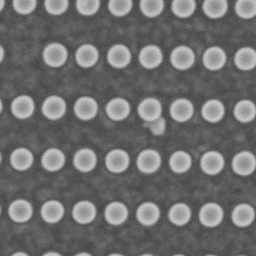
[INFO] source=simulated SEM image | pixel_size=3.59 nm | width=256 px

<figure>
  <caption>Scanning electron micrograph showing a regular array of raised bodies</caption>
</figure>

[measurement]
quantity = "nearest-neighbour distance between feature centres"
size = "31.6 px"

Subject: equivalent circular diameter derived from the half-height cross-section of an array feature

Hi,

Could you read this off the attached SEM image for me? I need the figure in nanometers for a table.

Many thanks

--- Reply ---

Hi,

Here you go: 80.7